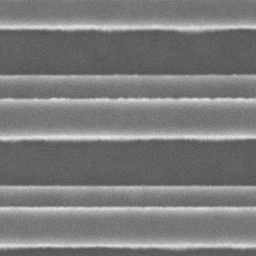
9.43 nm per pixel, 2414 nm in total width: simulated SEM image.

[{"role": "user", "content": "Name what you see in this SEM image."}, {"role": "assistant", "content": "lines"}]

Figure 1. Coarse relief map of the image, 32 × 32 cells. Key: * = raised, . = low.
********************************
********************************
********************************
.*.....*..*..*.**.....*****.....
................................
................................
................................
................................
................................
................................
********************************
********************************
********************************
********************************
********************************
********************************
********************************
................................
................................
................................
................................
................................
................................
********************************
********************************
********************************
********************************
********************************
********************************
********************************
********************************
................................